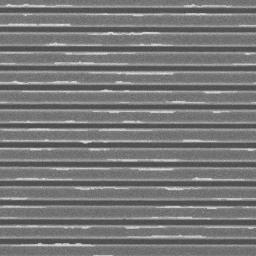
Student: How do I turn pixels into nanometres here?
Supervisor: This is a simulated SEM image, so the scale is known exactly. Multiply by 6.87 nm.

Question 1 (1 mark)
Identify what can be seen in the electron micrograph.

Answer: parallel lines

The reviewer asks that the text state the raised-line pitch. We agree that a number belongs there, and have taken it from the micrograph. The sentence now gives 19.3 pixels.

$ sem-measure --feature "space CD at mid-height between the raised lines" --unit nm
41.2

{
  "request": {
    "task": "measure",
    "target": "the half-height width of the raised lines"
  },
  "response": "12.9 pixels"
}